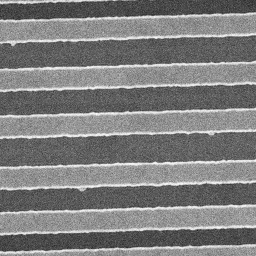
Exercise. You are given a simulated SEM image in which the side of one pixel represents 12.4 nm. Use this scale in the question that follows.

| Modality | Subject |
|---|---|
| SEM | lines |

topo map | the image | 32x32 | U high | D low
DDDDDDDDDDDDDDDDDDDDDDDDDDDDDDDD
DDDDDDDDDDDDDDDDDDDDDDDDDDDDDDDD
DDDDDDUUUUUUUUUUUUUUUUUUUUUUUUUU
UUUUUUUUUUUUUUUUUUUUUUUUUUUUUUUU
UUUUUUUUUUUUUUUUUUUUUUUUUUUUUDDD
DDDDDDDDDDDDDDDDDDDDDDDDDDDDDDDD
DDDDDDDDDDDDDDDDDDDDDDDDDDDDDDDD
DDDDDDDDDDDDDDDDDDDDDDDDDDDDDDDD
DDDDDUUUUUUUUUUUUUUUUUUUUUUUUUUU
UUUUUUUUUUUUUUUUUUUUUUUUUUUUUUUU
UUUUUUUUUUUUUUUUUUUUUUUUUUUUUUUU
DDDDDDDDDDDDDDDDDDDDDDDDDDDDDDDD
DDDDDDDDDDDDDDDDDDDDDDDDDDDDDDDD
DDDDDDDDDDDDDDDDDDDDDDDDDDDDDDDD
DUDDUUUUUUUUUUUUUUUUUUUUUUUUUUUU
UUUUUUUUUUUUUUUUUUUUUUUUUUUUUUUU
UUUUUUUUUUUUUUUUUUUUUUUUUUUUDDDD
DDDDDDDDDDDDDDDDDDDDDDDDDDDDDDDD
DDDDDDDDDDDDDDDDDDDDDDDDDDDDDDDD
DDDDDDDDDDDDDDDDDDDDDDDDDDDDDDDD
DDDDDDDDDDDDDDUUUUUUUUUUUUUUUUUU
UUUUUUUUUUUUUUUUUUUUUUUUUUUUUUUU
UUUUUUUUUUUUUUUUUUUUUUUUUUUUUUUU
UUUUUUDDDDDDDDDDDDDDDDDDDDDDDDDD
DDDDDDDDDDDDDDDDDDDDDDDDDDDDDDDD
DDDDDDDDDDDDDDDDDDDDDDDDDDDDDDDD
DDDUUUUUUUUUUUUUUUUUUUUUUUUUUUUU
UUUUUUUUUUUUUUUUUUUUUUUUUUUUUUUU
UUUUUUUUUUUUUUUUUUUUUUUUUUUUUDDD
DDDDDDDDDDDDDDDDDDDDDDDDDDDDDDDD
DDDDDDDDDDDDDDDDDDDDDDDDDDDDDDDD
UUUUUUUUUUUUUUUUUUUUUUUUUUUUUUUU